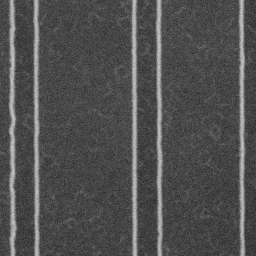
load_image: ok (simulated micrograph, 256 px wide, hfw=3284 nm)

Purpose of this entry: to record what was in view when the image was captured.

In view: one or a few lines or trenches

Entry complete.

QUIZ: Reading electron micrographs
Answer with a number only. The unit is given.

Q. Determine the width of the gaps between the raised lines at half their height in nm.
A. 1150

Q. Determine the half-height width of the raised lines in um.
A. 0.313